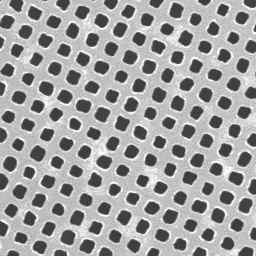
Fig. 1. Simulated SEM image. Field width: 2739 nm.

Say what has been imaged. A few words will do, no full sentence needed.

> a regular array of holes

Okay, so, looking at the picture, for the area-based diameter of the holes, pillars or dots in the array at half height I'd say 143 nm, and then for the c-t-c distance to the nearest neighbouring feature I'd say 0.219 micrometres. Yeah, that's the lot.